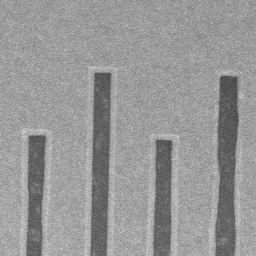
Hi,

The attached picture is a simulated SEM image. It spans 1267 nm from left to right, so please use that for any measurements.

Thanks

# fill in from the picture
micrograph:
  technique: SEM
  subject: one or a few lines or trenches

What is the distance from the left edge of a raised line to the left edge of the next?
314 nm